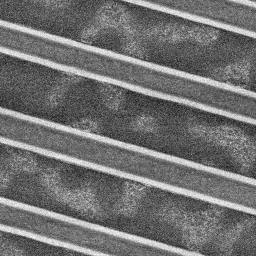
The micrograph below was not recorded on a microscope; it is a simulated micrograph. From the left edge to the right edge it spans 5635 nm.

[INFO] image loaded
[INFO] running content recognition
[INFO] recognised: one or a few lines or trenches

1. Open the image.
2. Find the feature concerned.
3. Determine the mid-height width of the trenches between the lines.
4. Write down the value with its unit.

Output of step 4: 1290 nm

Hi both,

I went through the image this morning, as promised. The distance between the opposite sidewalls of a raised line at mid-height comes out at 25.5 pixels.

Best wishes